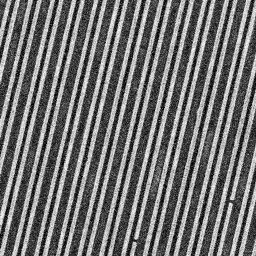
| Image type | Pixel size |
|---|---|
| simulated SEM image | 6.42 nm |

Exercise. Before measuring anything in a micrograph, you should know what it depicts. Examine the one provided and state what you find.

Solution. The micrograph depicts parallel lines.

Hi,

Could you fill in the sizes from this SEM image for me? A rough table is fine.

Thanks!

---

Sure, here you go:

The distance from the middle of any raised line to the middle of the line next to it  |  67.8 nanometres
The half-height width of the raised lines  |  0.0242 µm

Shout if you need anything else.